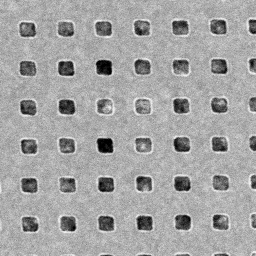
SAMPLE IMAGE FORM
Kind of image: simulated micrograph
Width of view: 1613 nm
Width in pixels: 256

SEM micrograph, a regular array of holes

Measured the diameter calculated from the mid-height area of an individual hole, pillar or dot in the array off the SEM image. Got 112 nm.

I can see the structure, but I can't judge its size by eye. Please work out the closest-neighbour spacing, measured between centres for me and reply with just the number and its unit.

240 nanometres